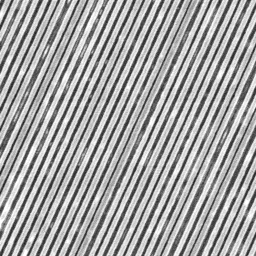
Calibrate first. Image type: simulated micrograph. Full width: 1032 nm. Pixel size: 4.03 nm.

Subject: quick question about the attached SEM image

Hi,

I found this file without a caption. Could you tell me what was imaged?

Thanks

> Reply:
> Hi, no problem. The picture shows parallel lines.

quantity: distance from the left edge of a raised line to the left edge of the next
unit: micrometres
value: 0.0348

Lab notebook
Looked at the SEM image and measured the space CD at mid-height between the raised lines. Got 17.4 nanometers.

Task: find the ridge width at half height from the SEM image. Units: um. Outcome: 0.0179